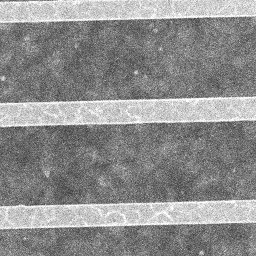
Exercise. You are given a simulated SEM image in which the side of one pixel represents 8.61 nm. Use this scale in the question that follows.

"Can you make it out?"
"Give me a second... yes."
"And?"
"one or a few lines or trenches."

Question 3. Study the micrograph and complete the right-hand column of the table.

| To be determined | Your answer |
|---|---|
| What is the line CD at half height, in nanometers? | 188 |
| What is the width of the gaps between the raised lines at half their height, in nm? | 697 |